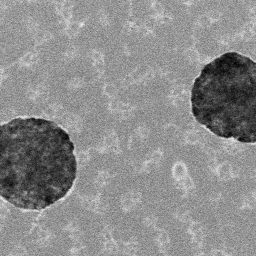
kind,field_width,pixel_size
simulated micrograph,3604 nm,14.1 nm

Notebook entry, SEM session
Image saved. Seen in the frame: holes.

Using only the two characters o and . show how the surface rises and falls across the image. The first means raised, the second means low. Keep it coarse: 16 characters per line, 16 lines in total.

oooooooooooooooo
oooooooooooooooo
oooooooooooooooo
oooooooooooooo.o
ooooooooooooo...
oooooooooooo....
oooooooooooo....
o..ooooooooo....
....oooooooooo..
.....ooooooooooo
.....ooooooooooo
.....ooooooooooo
....oooooooooooo
oooooooooooooooo
oooooooooooooooo
oooooooooooooooo